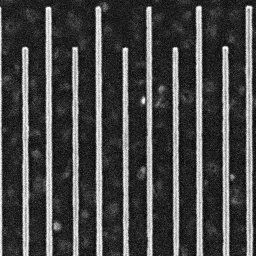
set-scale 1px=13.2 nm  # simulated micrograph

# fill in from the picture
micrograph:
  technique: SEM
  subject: parallel lines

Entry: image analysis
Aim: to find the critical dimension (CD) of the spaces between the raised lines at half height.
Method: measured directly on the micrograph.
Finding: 268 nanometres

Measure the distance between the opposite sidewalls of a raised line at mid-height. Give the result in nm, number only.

51.3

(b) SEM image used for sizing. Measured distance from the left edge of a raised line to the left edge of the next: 329 nanometers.